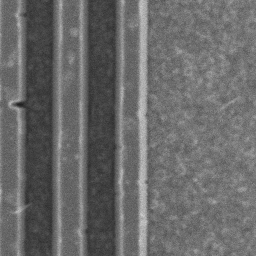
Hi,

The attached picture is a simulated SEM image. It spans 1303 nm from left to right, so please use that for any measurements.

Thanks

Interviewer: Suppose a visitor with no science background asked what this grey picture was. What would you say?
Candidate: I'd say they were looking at parallel lines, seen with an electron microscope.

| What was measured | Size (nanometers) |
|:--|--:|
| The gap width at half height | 168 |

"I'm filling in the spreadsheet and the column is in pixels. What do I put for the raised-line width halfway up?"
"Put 27.5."